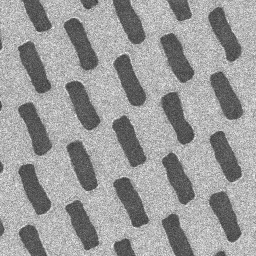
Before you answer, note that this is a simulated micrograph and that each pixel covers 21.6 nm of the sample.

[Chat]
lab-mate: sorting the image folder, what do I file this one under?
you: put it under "a regular array of holes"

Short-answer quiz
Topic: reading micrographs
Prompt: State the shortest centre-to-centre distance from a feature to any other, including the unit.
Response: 1.14 um